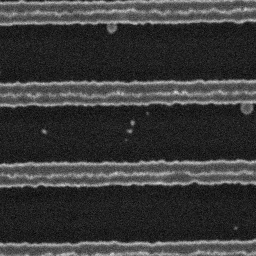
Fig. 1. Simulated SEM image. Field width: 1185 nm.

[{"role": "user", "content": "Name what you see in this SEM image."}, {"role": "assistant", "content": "lines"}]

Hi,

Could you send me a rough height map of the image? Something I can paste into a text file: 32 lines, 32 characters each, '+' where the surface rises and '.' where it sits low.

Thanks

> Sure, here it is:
++++++++++++++++++++++++++++++++
++++++++++++++++++++++++++++++++
++++++++++++++++++++++++++++++++
................................
................................
................................
................................
................................
................................
................................
..++++++++++++++++++++++++++++++
++++++++++++++++++++++++++++++++
++++++++++++++++++++++++++++++++
................................
................................
................................
................................
................................
................................
................................
...+.+++++++++++.+++++++++++++++
++++++++++++++++++++++++++++++++
++++++++++++++++++++++++++++++++
................................
................................
................................
................................
................................
................................
................................
..........++++++++++++++++++++++
++++++++++++++++++++++++++++++++